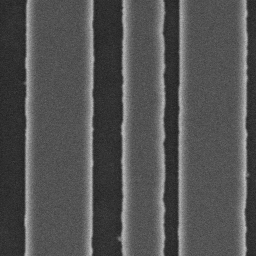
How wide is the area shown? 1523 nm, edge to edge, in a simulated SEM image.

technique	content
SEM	lines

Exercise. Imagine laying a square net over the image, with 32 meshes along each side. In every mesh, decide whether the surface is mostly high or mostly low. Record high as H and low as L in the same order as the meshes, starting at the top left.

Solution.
LLLHHHHHHHHHLLLHHHHHLLLHHHHHHHHL
LLLHHHHHHHHHLLLHHHHHLLLHHHHHHHHL
LLLHHHHHHHHHLLLHHHHHLLLHHHHHHHHL
LLLHHHHHHHHHLLLHHHHHLLLHHHHHHHHL
LLLHHHHHHHHHLLLHHHHHLLLHHHHHHHHL
LLLHHHHHHHHHLLLHHHHHLLLHHHHHHHHL
LLLHHHHHHHHHLLLHHHHHLLHHHHHHHHHL
LLLHHHHHHHHHLLLHHHHHLLLHHHHHHHHL
LLLHHHHHHHHHLLLHHHHHHLLHHHHHHHHL
LLLHHHHHHHHHLLLHHHHHLLLHHHHHHHHL
LLLHHHHHHHHHLLLHHHHHLLHHHHHHHHHL
LLLHHHHHHHHHLLLHHHHHHLHHHHHHHHHL
LLLHHHHHHHHHLLLHHHHHHLHHHHHHHHHL
LLLHHHHHHHHHLLLHHHHHHLHHHHHHHHHL
LLLHHHHHHHHHLLLHHHHHLLHHHHHHHHHL
LLLHHHHHHHHLLLLHHHHHLLHHHHHHHHHL
LLLHHHHHHHHHLLLHHHHHLLHHHHHHHHHL
LLLHHHHHHHHLLLLHHHHHLLHHHHHHHHHL
LLLHHHHHHHHLLLLHHHHHLLHHHHHHHHHL
LLLHHHHHHHHLLLLHHHHHLLHHHHHHHHHL
LLLHHHHHHHHHLLLHHHHHHLHHHHHHHHHL
LLLHHHHHHHHLLLLHHHHHHLHHHHHHHHHL
LLLHHHHHHHHLLLLHHHHHHLHHHHHHHHHL
LLLHHHHHHHHLLLLHHHHHLLHHHHHHHHHL
LLLHHHHHHHHLLLLHHHHHLLHHHHHHHHHL
LLLHHHHHHHHLLLLHHHHHLLHHHHHHHHHL
LLLHHHHHHHHLLLLHHHHHHLHHHHHHHHHL
LLLHHHHHHHHLLLLHHHHHLLHHHHHHHHHL
LLLHHHHHHHHLLLLHHHHHLLHHHHHHHHHL
LLLHHHHHHHHLLLLHHHHHHLHHHHHHHHHL
LLLHHHHHHHHLLLLHHHHHLLHHHHHHHHHL
LLLHHHHHHHHLLLLHHHHHLLHHHHHHHHHL